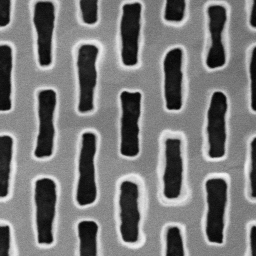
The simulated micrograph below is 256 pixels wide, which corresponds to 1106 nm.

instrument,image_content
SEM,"a regular array of holes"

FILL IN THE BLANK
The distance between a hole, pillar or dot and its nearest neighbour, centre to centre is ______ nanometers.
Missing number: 258